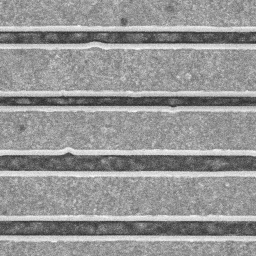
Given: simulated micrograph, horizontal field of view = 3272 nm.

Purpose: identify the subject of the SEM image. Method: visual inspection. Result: one or a few lines or trenches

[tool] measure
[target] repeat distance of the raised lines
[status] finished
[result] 806 nm